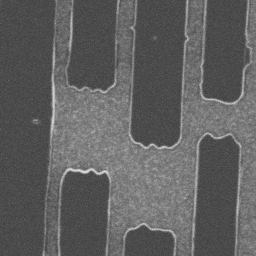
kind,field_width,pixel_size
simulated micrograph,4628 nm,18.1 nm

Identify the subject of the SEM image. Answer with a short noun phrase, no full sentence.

one or a few lines or trenches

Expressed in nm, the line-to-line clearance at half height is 302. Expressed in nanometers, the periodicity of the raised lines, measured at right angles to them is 1180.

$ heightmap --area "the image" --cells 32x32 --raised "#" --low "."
#######..######..######...#####.
#######..######..######...#####.
#######..######..######...#####.
#######..######..######..######.
#######..######..######..######.
#######..######..######..######.
#######..######..######..######.
#######..#####...######..######.
#######.######...######..######.
#######.######...######..#####..
#######.######...######..#####..
#######.........#######..#####..
#######.........#######....###..
#######.........#######.........
#######.........#######.........
#######.........#######.........
######..........#######.........
######...........#####...####...
######...................#####..
######...................#####..
######...................#####..
######..####.............#####..
######..######...........#####..
######..######..........######..
######..######..........######..
######.#######..........######..
######.#######..........######..
######.#######..........######..
######.#######...##.....######..
######.######...######..######..
######.######...######..#####...
######.######..#######..#####...